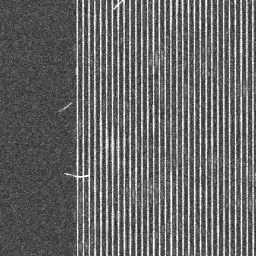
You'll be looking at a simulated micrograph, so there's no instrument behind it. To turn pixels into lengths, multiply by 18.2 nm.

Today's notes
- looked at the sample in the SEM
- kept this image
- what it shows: parallel lines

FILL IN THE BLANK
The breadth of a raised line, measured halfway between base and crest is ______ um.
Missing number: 0.0159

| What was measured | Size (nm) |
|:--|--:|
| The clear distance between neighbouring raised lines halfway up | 90.8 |